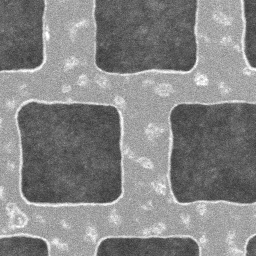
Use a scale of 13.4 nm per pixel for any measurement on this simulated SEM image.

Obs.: holes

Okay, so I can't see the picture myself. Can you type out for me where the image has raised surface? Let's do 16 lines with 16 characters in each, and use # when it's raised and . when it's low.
...###......###.
...###......###.
...###......###.
...###......###.
#######..#######
################
##....#####.....
#.......###.....
#.......###.....
#.......###.....
#.......###.....
#.......###.....
##.....####.....
################
################
...###......###.